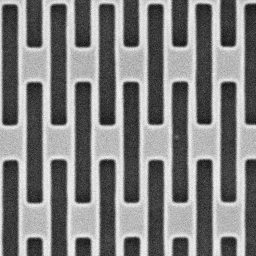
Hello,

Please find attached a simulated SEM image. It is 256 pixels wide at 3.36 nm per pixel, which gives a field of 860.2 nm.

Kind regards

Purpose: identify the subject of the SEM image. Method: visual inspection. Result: groups of lines, slits or small figures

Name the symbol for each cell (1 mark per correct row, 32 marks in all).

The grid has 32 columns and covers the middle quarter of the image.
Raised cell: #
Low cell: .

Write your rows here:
.########....########....#######
.########....########....#######
.########....########....#######
.########....########....#######
.##....##....##...###....##....#
.##....##....##....##....##....#
.##....##....##....##....##....#
.##....##....##....##....##....#
.##....##....##....##....##....#
.##....##....##....##....##....#
.##....##....##....##....##....#
.##....##....##....##....##....#
.##....##....##....##....##....#
.##....##....##....##....##....#
.##....##....##....##....##....#
###....###..###....########....#
###....########....########....#
###....########....########....#
###....########....########....#
###....########....########....#
###....########....########....#
###....########....########....#
###....########....########....#
###....########....########....#
.##....##....##....##....##....#
.##....##....##....##....##....#
.##....##....##....##....##....#
.##....##....##....##....##....#
.##....##....##....##....##....#
.##....##....##....##....##....#
.##....##....##....##....##....#
.##....##....##....##....##....#